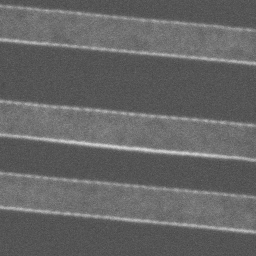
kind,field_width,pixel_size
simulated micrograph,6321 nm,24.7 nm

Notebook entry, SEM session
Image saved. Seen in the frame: lines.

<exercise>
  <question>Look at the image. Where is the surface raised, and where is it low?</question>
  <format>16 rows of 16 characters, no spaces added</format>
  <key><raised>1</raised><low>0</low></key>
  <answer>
0111111111111111
0000000000001111
1000000000000000
1111111111100000
1111111111111111
1111111111111111
0111111111111111
0000000000001111
1000000000000000
1111111111100000
1111111111111111
0000000111111111
0000000000000000
1111110000000000
1111111111111111
1111111111111111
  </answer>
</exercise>